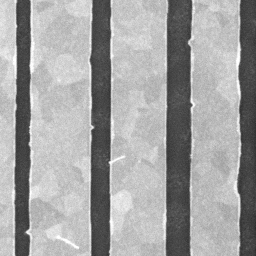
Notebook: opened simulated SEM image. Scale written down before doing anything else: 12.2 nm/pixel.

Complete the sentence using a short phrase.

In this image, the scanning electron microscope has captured one or a few lines or trenches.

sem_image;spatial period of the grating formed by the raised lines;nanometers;939